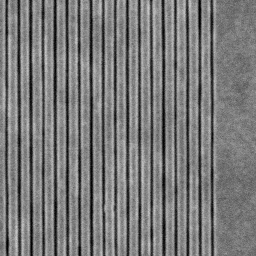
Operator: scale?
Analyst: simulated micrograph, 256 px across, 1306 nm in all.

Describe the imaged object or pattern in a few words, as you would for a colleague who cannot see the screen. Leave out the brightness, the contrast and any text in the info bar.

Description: parallel lines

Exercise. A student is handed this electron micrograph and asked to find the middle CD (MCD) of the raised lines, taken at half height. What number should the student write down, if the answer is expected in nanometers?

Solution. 47.2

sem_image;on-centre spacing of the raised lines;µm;0.0615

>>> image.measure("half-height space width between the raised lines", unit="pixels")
3.37